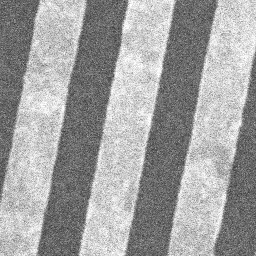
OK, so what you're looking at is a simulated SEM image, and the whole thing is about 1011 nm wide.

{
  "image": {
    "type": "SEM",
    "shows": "one or a few lines or trenches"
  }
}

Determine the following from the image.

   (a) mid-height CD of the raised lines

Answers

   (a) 175 nanometres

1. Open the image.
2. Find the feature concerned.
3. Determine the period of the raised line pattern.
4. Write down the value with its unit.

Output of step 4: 0.344 micrometres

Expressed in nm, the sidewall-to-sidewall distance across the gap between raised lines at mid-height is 172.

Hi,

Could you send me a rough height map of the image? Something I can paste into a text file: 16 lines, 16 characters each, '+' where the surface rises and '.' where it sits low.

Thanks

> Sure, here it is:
..+++...+++...++
..+++...+++..+++
..+++...++...+++
..+++..+++...+++
..++...+++...+++
.+++...+++...++.
.+++...+++..+++.
.+++...++...+++.
.+++..+++...+++.
.++...+++...+++.
+++...+++...++..
+++...+++..+++..
+++...++...+++..
+++..+++...+++..
+++..+++...+++..
++...+++...++...